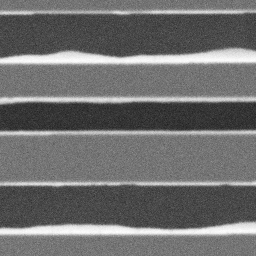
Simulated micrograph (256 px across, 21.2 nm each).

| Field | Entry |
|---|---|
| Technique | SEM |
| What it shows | lines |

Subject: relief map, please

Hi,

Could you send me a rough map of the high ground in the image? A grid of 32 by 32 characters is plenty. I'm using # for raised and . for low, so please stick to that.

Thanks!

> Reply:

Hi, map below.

################################
###########################.....
................................
................................
................................
................................
................................
......######...........#########
################################
################################
################################
################################
##..............................
................................
................................
................................
...............................#
################################
################################
################################
################################
################################
################################
................................
................................
................................
................................
................................
................................
################################
################################
################################